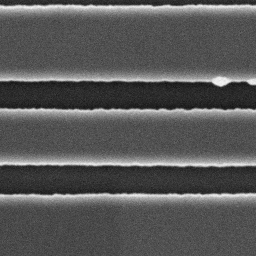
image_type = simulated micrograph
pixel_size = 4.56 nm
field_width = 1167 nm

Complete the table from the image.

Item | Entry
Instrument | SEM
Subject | lines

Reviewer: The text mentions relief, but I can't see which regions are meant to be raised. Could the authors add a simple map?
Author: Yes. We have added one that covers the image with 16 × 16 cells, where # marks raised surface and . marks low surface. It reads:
################
################
################
################
################
................
................
################
################
################
................
................
################
################
################
################